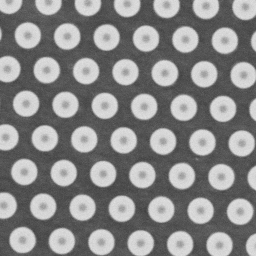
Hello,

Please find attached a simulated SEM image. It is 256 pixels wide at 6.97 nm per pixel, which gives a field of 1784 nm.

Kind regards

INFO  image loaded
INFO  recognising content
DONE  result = an array of small figures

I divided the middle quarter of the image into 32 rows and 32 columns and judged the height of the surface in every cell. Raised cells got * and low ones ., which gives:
...*****....******.....*****....
..*******...*******...******....
..*******...******....******....
...*****....******....******....
....***......****......*****....
................................
................................
**.......**.....................
***.....*****.....*****.....****
****...******....******....*****
****...******....******....*****
***....******....******....*****
***.....*****....******....*****
.........**.......****......****
................................
................................
...****......****......***......
..******....******....*****.....
..******....******....******....
..******....******....******...*
..******....******....******....
...****......****.....*****.....
........................**......
................................
**.......**.....................
***....*****.....*****......****
***....******....******....*****
***....******...*******...******
***....******...*******...******
**.....*****.....*****.....*****
........***.......***......*****
................................